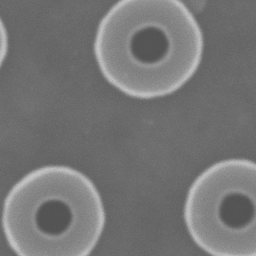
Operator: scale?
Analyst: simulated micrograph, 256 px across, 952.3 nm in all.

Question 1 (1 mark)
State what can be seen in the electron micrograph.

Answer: ring-shaped raised bodies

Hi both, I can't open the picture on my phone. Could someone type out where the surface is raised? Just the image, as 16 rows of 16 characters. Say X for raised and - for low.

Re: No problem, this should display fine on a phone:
-------XXXX-----
------XXXXXX----
------XX--XX----
------XX--XX----
-------XXXXX----
--------XXX-----
----------------
----------------
----------------
----------------
-------------XXX
-XXXXX------XXXX
-XXXXX------XX--
XX---X------XX--
XXX-XX------XXXX
-XXXXX-------XXX